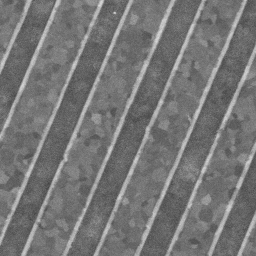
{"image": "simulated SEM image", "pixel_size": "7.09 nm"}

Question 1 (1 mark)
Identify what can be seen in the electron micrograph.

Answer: one or a few lines or trenches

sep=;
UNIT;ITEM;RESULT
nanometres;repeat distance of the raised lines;471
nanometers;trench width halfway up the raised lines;193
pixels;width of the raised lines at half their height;38.7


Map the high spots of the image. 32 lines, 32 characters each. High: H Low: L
HHHLLLLHHHHHHLLLHHHHHHLLLHHHHHLL
HHHLLLLHHHHHLLLLHHHHHLLLLHHHHHLL
HHHLLLHHHHHHLLLHHHHHHLLLHHHHHHLL
HHLLLLHHHHHLLLLHHHHHLLLLHHHHHLLL
HHLLLHHHHHHLLLHHHHHHLLLLHHHHHLLL
HLLLLHHHHHLLLLHHHHHLLLLHHHHHLLLL
HLLLLHHHHHLLLLHHHHHLLLLHHHHHLLLL
LLLLHHHHHHLLLHHHHHHLLLHHHHHLLLLH
LLLLHHHHHLLLLHHHHHLLLLHHHHHLLLLH
LLLHHHHHHLLLHHHHHHLLLHHHHHHLLLHH
LLLHHHHHLLLLHHHHHLLLLHHHHHLLLLHH
LLHHHHHHLLLLHHHHHLLLLHHHHHLLLLHH
LLHHHHHLLLLHHHHHLLLLHHHHHLLLLHHH
LLHHHHHLLLLHHHHHLLLLHHHHHLLLLHHH
LHHHHHHLLLHHHHHHLLLHHHHHHLLLHHHH
LHHHHHLLLLHHHHHLLLLHHHHHLLLLHHHH
HHHHHHLLLHHHHHHLLLHHHHHHLLLHHHHH
HHHHHLLLLHHHHHLLLLHHHHHLLLLHHHHH
HHHHHLLLLHHHHHLLLLHHHHHLLLLHHHHH
HHHHHLLLHHHHHLLLLHHHHHLLLLHHHHHL
HHHHLLLLHHHHHLLLLHHHHHLLLLHHHHHL
HHHHLLLHHHHHHLLLHHHHHHLLLHHHHHHL
HHHLLLLHHHHHLLLLHHHHHLLLLHHHHHLL
HHHLLLHHHHHHLLLHHHHHHLLLLHHHHHLL
HHLLLLHHHHHLLLLHHHHHLLLLHHHHHLLL
HHLLLLHHHHHLLLLHHHHHLLLLHHHHHLLL
HHLLLHHHHHLLLLHHHHHLLLLHHHHHHLLL
HLLLLHHHHHLLLLHHHHHLLLLHHHHHLLLL
HLLLHHHHHHLLLHHHHHHLLLHHHHHHLLLH
LLLLHHHHHLLLLHHHHHLLLLHHHHHLLLLH
LLLLHHHHHLLLLHHHHHLLLLHHHHHLLLLH
LLLHHHHHLLLLHHHHHLLLLHHHHHLLLLHH